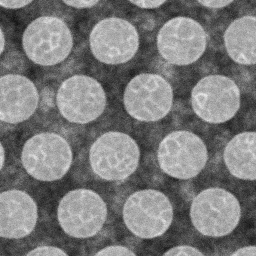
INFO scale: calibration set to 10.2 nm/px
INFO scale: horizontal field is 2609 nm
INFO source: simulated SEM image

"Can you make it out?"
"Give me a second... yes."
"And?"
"a regular array of raised bodies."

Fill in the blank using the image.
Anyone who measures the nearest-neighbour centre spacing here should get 670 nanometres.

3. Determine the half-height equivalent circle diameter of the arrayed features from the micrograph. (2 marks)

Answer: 489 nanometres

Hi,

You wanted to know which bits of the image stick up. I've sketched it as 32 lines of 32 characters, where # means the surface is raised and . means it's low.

###......###.....###.....###....
................................
....###......##......###......##
...#####....#####.#.#####....###
...######..######...######..####
...######..######...######..####
...######...#####...#####....###
....####.....###.....###.....###
................................
.#...............###............
####....####....#####....####...
#####..######...#####...######..
#####..######...#####...######..
####...######...#####...######..
####....####.....###.....####...
................................
......................#.........
....####....#####...#####....###
...######..######...######..####
...######..######...######..####
...######..######...######..####
....####....####.....####....###
.....##.........................
................................
####....####....#####....####...
####...######...#####...######..
#####..######..######...######..
#####..######...#####...######..
####....#####...#####....####...
###......##......###......##....
................................
....####....####.....####.....##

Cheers